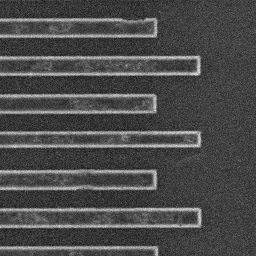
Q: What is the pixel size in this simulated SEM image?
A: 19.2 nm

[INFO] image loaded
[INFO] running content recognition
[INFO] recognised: parallel lines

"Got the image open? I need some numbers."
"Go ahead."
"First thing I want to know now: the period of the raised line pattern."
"0.729 um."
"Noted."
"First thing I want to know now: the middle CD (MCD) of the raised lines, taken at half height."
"314 nanometres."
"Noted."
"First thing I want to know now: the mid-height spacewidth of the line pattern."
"408 nanometers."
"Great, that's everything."